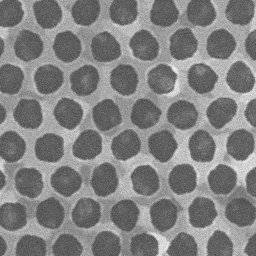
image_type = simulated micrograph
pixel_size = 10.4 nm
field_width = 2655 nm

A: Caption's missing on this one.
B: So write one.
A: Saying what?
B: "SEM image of a regular array of holes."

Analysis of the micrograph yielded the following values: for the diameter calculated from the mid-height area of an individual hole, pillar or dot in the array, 321 nm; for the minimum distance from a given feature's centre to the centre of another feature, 386 nm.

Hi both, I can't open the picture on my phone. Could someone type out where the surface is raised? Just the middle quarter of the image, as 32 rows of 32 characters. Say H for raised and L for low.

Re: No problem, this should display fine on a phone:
HHHHLLLHHHHHHLLLLHHHHHHLLLLHHHHH
HHHLLLLLLHHHLLLLLLHHHLLLLLLLHHHL
HHLLLLLLLHHLLLLLLLHHHLLLLLLLHHHL
HLLLLLLLLHHLLLLLLLLHHLLLLLLLHHHL
HLLLLLLLLHHLLLLLLLLHHLLLLLLLHHHL
HHLLLLLLHHHHLLLLLLHHHLLLLLLLHHHL
HHLLLLLLHHHHLLLLLLHHHHLLLLLHHHHH
HHHLLLLHHHHHHHLLLHHHHHHLLLHHHHHH
LLHHHHHHHHHHHHHHHHHHHHHHHHHHHHHH
LLLHHHHHHLLLLHHHHHLLLLHHHHHHLLLL
LLLLHHHHLLLLLLHHHLLLLLLHHHLLLLLL
LLLLLHHLLLLLLLHHHLLLLLLLHHLLLLLL
LLLLLHHLLLLLLLHHHLLLLLLLLHLLLLLL
LLLLLHHLLLLLLLHHHLLLLLLLHHLLLLLL
LLLLHHHLLLLLLLHHHLLLLLLLHHLLLLLL
LLLLHHHHLLLLLHHHHHLLLLLHHHHLLLLL
HLHHHLLLHLLLHHHLLHHHHHHHHLHHHLLL
HHHHLLLLLHHHHHLLLLHHHHLLLLLHHHHH
HHHLLLLLLHHHLLLLLLLHHLLLLLLLHHHL
HHLLLLLLLLHHLLLLLLLHHLLLLLLLHHHL
HHLLLLLLLLHLLLLLLLLHHLLLLLLLLHHL
HHLLLLLLLLHHLLLLLLLHHLLLLLLLHHHL
HHLLLLLLLHHHLLLLLLLHHHLLLLLLHHHL
HHHLLLLLHHHHHLLLLHHHHHLLLLLHHHHH
HHHHHHHHHHLHHHHHHHHHHHHHLLHHHHHH
LHHHHHHHHLLLHHHHHHLLLLHHHHHHLLLL
LLLHHHHLLLLLLHHHHLLLLLLHHHHLLLLL
LLLLHHHLLLLLLHHHHLLLLLLHHHLLLLLL
LLLLHHHLLLLLLHHHLLLLLLLLHHLLLLLL
LLLLLHHLLLLLLLHHHLLLLLLLHHLLLLLL
LLLLHHHLLLLLLHHHHLLLLLLLHHLLLLLL
LLLLHHHLLLLLLHHHHLLLLLLLHHHLLLLL